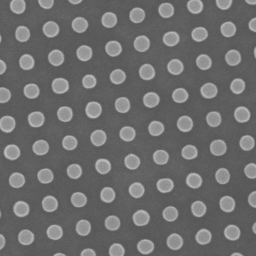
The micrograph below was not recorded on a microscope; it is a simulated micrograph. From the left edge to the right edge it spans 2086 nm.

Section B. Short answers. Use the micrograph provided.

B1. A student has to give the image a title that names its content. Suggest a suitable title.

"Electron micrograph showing a regular array of raised bodies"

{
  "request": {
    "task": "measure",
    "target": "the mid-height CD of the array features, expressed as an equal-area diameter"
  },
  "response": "122 nm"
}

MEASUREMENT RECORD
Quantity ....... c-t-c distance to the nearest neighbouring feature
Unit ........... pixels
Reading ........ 28.6